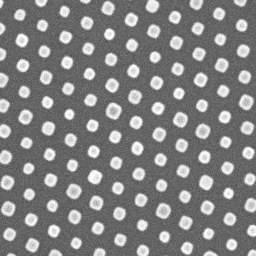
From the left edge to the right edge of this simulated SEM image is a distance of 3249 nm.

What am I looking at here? a regular array of raised bodies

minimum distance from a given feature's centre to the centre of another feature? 320 nm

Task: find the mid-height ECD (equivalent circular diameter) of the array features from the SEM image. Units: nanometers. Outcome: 135